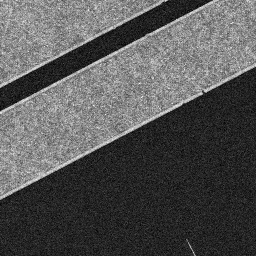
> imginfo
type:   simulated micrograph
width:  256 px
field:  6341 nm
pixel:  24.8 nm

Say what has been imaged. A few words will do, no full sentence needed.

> one or a few lines or trenches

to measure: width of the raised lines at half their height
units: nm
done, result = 1860